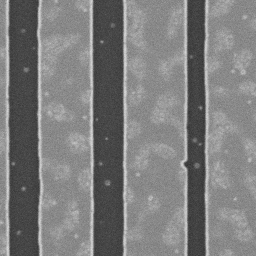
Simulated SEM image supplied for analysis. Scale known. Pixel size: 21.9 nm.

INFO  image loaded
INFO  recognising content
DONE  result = one or a few lines or trenches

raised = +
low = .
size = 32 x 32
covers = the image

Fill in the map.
+....++++++.....+++++++...++++++
+....++++++.....+++++++...++++++
+....++++++.....+++++++...++++++
+....++++++.....+++++++...++++++
+....++++++.....+++++++...++++++
+....++++++.....+++++++...++++++
+....++++++.....+++++++...++++++
+....++++++.....+++++++...++++++
+....++++++.....+++++++...++++++
+....++++++.....+++++++...++++++
+....++++++.....+++++++...++++++
+....++++++.....+++++++...++++++
+....++++++.....+++++++...++++++
+....++++++.....+++++++...++++++
+....++++++.....+++++++...++++++
+....++++++.....+++++++...++++++
+....++++++.....+++++++...++++++
+....++++++.....+++++++...++++++
+....++++++.....+++++++...++++++
+....++++++.....+++++++...++++++
+....++++++.....+++++++...++++++
+....+++++++....+++++++...++++++
+....++++++.....+++++++...++++++
+....++++++.....+++++++...++++++
+....++++++.....+++++++...++++++
+....++++++.....+++++++...++++++
+....+++++++....+++++++...++++++
+....++++++.....+++++++...++++++
+....++++++.....+++++++...++++++
+....++++++.....+++++++...++++++
+....++++++.....+++++++...++++++
+....++++++.....+++++++...++++++